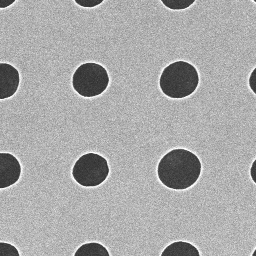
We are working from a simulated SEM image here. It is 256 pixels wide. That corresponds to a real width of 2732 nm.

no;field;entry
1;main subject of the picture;holes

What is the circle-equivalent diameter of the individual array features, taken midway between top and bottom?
390 nm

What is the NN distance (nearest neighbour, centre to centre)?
945 nm